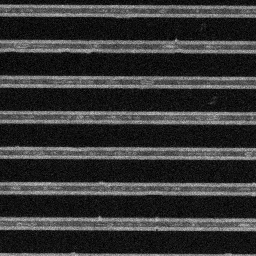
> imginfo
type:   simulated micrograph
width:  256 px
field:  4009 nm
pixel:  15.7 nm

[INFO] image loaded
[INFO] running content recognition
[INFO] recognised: parallel lines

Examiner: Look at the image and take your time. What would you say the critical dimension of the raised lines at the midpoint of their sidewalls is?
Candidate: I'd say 8.5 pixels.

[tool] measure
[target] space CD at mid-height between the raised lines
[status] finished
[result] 417 nanometres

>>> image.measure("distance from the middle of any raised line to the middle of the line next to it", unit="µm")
0.557